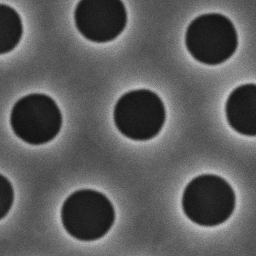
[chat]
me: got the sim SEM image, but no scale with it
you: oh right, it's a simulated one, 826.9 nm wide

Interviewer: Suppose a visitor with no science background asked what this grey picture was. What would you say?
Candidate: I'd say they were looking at holes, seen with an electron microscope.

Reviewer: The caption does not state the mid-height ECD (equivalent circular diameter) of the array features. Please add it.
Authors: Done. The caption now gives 169 nanometers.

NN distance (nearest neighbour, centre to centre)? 336 nm